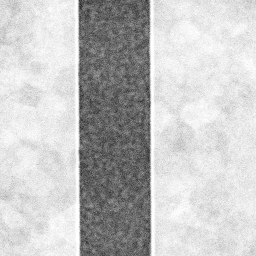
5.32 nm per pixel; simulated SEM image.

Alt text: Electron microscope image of one or a few lines or trenches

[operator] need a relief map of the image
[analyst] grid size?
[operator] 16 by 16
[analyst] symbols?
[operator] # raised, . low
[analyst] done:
#####....#######
#####....#######
#####....#######
#####....#######
#####....#######
#####.....######
#####.....######
#####.....######
#####.....######
#####.....######
#####.....######
#####.....######
#####.....######
#####.....######
#####.....######
#####.....######